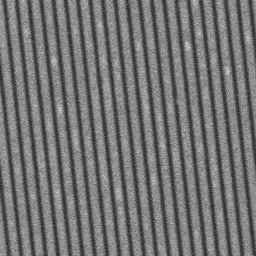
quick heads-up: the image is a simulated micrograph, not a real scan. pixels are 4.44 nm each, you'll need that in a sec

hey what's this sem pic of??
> parallel lines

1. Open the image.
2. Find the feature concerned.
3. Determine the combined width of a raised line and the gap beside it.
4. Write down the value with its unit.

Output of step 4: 0.0542 micrometres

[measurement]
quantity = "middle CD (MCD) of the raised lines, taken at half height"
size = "34.1 nm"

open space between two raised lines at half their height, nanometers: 19.3